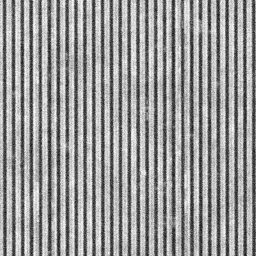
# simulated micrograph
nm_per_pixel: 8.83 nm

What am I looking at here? parallel lines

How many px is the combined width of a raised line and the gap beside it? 8.9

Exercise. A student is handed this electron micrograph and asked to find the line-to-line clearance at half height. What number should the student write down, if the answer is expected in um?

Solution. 0.043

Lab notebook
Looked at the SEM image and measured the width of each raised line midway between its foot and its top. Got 34.2 nm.